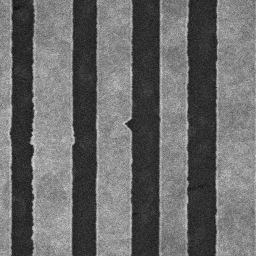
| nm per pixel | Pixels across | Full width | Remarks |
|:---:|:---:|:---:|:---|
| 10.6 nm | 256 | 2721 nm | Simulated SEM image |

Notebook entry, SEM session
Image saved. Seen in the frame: one or a few lines or trenches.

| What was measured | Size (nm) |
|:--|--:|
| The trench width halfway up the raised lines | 290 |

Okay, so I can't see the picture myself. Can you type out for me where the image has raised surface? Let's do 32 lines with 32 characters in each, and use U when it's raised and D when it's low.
UDDDUUUUUDDDUUUUDDDDUUUDDDDUUUUU
UDDDUUUUUDDDUUUUDDDDUUUDDDDUUUUU
UDDDUUUUUDDDUUUUDDDDUUUDDDDUUUUU
UDDDUUUUUDDDUUUUDDDDUUUDDDDUUUUU
UDDDUUUUUDDDUUUUDDDDUUUDDDDUUUUU
UDDDUUUUUDDDUUUUDDDDUUUDDDDUUUUU
UDDDUUUUUDDDUUUUDDDDUUUDDDDUUUUU
UUDDUUUUUDDDUUUUDDDDUUUDDDDUUUUU
UDDDUUUUUDDDUUUUDDDDUUUUDDDUUUUU
UDDDUUUUUDDDUUUUDDDDUUUDDDDUUUUU
UDDDUUUUUDDDUUUUDDDDUUUDDDDUUUUU
UDDDUUUUUDDDUUUUDDDDUUUDDDDUUUUU
UDDDUUUUUDDDUUUUDDDDUUUDDDDUUUUU
UDDDUUUUUDDDUUUUDDDDUUUDDDDUUUUU
UDDDUUUUUDDDUUUUDDDDUUUDDDDUUUUU
UDDDUUUUUDDDUUUUDDDDUUUDDDDUUUUU
UDDDUUUUUDDDUUUUDDDDUUUDDDDUUUUU
UDDDUUUUUDDDUUUUDDDDUUUDDDDUUUUU
UDDDUUUUUDDDUUUUDDDDUUUDDDDUUUUU
UDDDUUUUUDDDUUUUDDDDUUUDDDDUUUUU
UDDDUUUUUDDDUUUUDDDDUUUDDDDUUUUU
UDDDUUUUUDDDUUUUDDDDUUUDDDDUUUUU
UDDDUUUUUDDDUUUUDDDDUUUDDDDUUUUU
UDDDUUUUUDDDUUUUDDDDUUUDDDDUUUUU
UDDDUUUUUDDDUUUUDDDDUUUDDDDUUUUU
UDDDUUUUUDDDUUUUDDDDUUUDDDDUUUUU
UDDDUUUUUDDDUUUUDDDDUUUDDDDUUUUU
UDDDUUUUUDDDUUUUDDDDUUUDDDDUUUUU
UDDDUUUUUDDDUUUUDDDDUUUDDDDUUUUU
UDDDUUUUUDDDUUUUDDDDUUUDDDDUUUUU
UDDDUUUUUDDDUUUUDDDDUUUDDDDUUUUU
UDDDUUUUUDDDUUUUDDDDUUUDDDDUUUUU